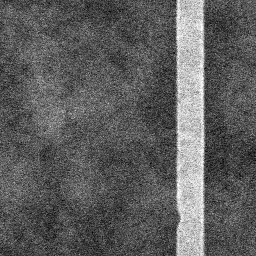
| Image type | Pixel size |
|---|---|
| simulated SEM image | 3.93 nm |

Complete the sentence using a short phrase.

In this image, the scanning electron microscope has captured one or a few lines or trenches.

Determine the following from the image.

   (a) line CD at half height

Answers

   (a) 98.8 nm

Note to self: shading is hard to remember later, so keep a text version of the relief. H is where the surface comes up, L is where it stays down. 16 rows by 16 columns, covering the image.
LLLLLLLLLLLHHLLL
LLLLLLLLLLLHHLLL
LLLLLLLLLLLHHLLL
LLLLLLLLLLLHHLLL
LLLLLLLLLLLHHLLL
LLLLLLLLLLLHHLLL
LLLLLLLLLLLHHLLL
LLLLLLLLLLLHHLLL
LLLLLLLLLLLHHLLL
LLLLLLLLLLLHHLLL
LLLLLLLLLLLHHLLL
LLLLLLLLLLLHHLLL
LLLLLLLLLLLHHLLL
LLLLLLLLLLLHHLLL
LLLLLLLLLLLHHLLL
LLLLLLLLLLLHHLLL